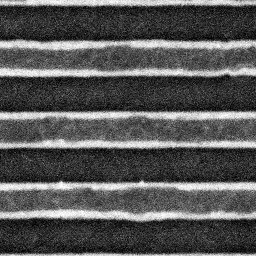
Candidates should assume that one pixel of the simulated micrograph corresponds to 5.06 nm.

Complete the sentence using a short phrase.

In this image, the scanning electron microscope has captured one or a few lines or trenches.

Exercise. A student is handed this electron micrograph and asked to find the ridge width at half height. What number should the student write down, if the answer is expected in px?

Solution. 31.1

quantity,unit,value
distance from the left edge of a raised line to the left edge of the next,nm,360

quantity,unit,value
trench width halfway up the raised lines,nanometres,201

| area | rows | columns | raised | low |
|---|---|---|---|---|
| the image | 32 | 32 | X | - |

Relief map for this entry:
--------------------------------
--------------------------------
--------------------------------
--------------------------------
--------------------------------
-XXXX--XX-XXXXXXXXXXXXXXXX---XXX
XXXXXXXXXXXXXXXXXXXXXXXXXXXXXXXX
XXXXXXXXXXXXXXXXXXXXXXXXXXXXXXXX
XXXXXXXXXXXXXXXXXXXXXXXXXXXXXXXX
--------------------------------
--------------------------------
--------------------------------
--------------------------------
--------------------------------
XXXXXXXXXXXXXXXXXXXXXXXXXXXXXXXX
XXXXXXXXXXXXXXXXXXXXXXXXXXXXXXXX
XXXXXXXXXXXXXXXXXXXXXXXXXXXXXXXX
XXXXXXXXXXXXXXXXXXXXXXXXXXXXXXXX
--------------------------------
--------------------------------
--------------------------------
--------------------------------
--------------------------------
XXXXXXXXXXXXXXXXXXXXXXXXXXXXXXXX
XXXXXXXXXXXXXXXXXXXXXXXXXXXXXXXX
XXXXXXXXXXXXXXXXXXXXXXXXXXXXXXXX
XXXXXXXXXXXXXXXXXXXXXXXXXXXXXXXX
--------------------------------
--------------------------------
--------------------------------
--------------------------------
--------------------------------